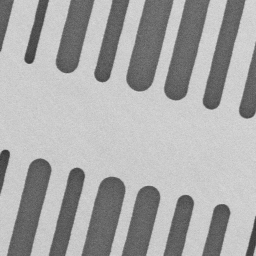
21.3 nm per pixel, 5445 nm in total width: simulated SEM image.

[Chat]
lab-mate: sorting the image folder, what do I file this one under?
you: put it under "groups of lines, slits or small figures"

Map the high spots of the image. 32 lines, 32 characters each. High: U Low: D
DDUUUDUUUDDDUUDDUUDDDDUDDDUUDDDU
DUUUDDUUDDDUUUDDUUDDDUUDDDUUDDUU
DUUUDDUUDDDUUDDDUUDDDUUDDDUUDDUU
DUUUDUUUDDDUUDDUUDDDDUDDDUUUDDUU
DUUUDUUUDDDUUDDUUDDDDUDDDUUDDDUU
UUUDDUUDDDUUUDDUUDDDUUDDDUUDDUUU
UUUDDUUDDDUUDDDUDDDDUUDDDUUDDUUU
UUUDUUUDDDUUDDUUDDDDUDDDUUDDDUUD
UUUUUUUDDDUUDDUUDDDDUDDDUUDDDUUD
UUUUUUUUUUUUDDUUDDDUUDDDUUDDUUUD
UUUUUUUUUUUUUUUUDDDUUDDDUUDDUUUD
UUUUUUUUUUUUUUUUUUUUUDDUUUDDUUDD
UUUUUUUUUUUUUUUUUUUUUUUUUDDDUUDD
UUUUUUUUUUUUUUUUUUUUUUUUUUDUUUDD
UUUUUUUUUUUUUUUUUUUUUUUUUUUUUUDD
UUUUUUUUUUUUUUUUUUUUUUUUUUUUUUUU
UUUUUUUUUUUUUUUUUUUUUUUUUUUUUUUU
UUUUUUUUUUUUUUUUUUUUUUUUUUUUUUUU
UUUUUUUUUUUUUUUUUUUUUUUUUUUUUUUU
DUUUUUUUUUUUUUUUUUUUUUUUUUUUUUUU
DUUUDDUUUUUUUUUUUUUUUUUUUUUUUUUU
DUUDDDUUUDUUUUUUUUUUUUUUUUUUUUUU
DUUDDDUUDDDUUDDUUUUUUUUUUUUUUUUU
UUUDDDUUDDUUDDDDUUDUUUUUUUUUUUUU
UUUDDDUUDDUUDDDDUDDDUUUDUUUUUUUU
UUDDDUUUDDUUDDDUUDDDUUDDUUUUUUUU
UUDDDUUDDDUDDDDUUDDDUUDDUUUDDUUU
UUDDDUUDDUUDDDDUDDDUUDDDUUDDDUUU
UUDDDUUDDUUDDDDUDDDUUDDDUUDDUUUU
UDDDUUUDDUUDDDUUDDDUUDDUUUDDUUUD
UDDDUUDDDUDDDDUDDDDUUDDUUUDDUUUD
UDDDUUDDUUDDDDUDDDUUUDDUUDDDUUUD